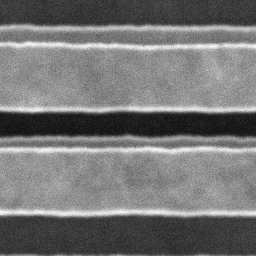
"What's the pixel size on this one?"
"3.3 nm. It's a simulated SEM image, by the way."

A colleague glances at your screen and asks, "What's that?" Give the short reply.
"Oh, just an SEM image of lines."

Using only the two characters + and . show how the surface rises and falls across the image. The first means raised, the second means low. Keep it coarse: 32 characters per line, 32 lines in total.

................................
................................
................................
+++++..++....++++++++++.+++++...
++++++++++++++++++++++++++++++++
++++++++++++++++++++++++++++++++
++++++++++++++++++++++++++++++++
++++++++++++++++++++++++++++++++
++++++++++++++++++++++++++++++++
++++++++++++++++++++++++++++++++
++++++++++++++++++++++++++++++++
++++++++++++++++++++++++++++++++
++++++++++++++++++++++++++++++++
++++++++++++++++++++++++++++++++
................................
................................
................................
++++++++++++++++++++++++++++++++
++++++++++++++++++++++++++++++++
++++++++++++++++++++++++++++++++
++++++++++++++++++++++++++++++++
++++++++++++++++++++++++++++++++
++++++++++++++++++++++++++++++++
++++++++++++++++++++++++++++++++
++++++++++++++++++++++++++++++++
++++++++++++++++++++++++++++++++
++++++++++++++++++++++++++++++++
................................
................................
................................
................................
................................